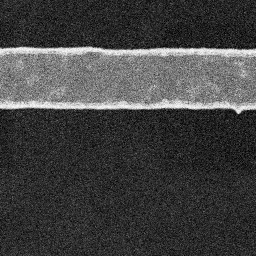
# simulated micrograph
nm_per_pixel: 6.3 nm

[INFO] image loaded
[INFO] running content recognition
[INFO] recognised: one or a few lines or trenches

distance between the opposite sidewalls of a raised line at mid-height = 353 nm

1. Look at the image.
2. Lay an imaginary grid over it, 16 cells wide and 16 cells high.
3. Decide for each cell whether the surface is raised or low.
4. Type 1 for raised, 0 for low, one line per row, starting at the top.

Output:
0000000000000000
0000000000000000
0000000000000000
1111111111111111
1111111111111111
1111111111111111
1111111111111111
0000000000000000
0000000000000000
0000000000000000
0000000000000000
0000000000000000
0000000000000000
0000000000000000
0000000000000000
0000000000000000